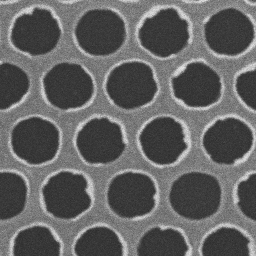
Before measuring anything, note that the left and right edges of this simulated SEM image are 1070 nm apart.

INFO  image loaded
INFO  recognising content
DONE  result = a regular array of holes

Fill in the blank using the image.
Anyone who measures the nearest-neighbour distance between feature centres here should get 0.261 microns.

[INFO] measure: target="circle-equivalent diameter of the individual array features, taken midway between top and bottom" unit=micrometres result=0.198